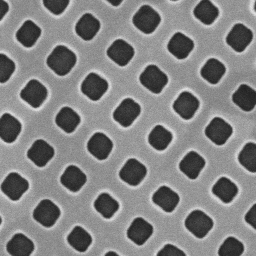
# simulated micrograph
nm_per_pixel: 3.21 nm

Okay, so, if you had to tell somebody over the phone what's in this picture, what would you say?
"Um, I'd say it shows a regular array of holes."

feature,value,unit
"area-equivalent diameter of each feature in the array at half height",85.2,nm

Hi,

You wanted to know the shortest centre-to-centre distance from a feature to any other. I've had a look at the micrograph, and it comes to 0.134 µm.